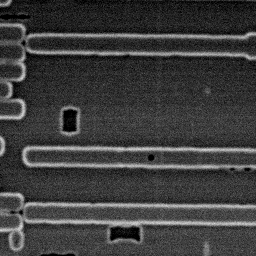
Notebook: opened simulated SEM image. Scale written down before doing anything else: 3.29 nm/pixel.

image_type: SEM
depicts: wiring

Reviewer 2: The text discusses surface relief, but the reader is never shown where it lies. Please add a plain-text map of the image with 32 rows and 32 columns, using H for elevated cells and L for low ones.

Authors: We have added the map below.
HLLLLLLLLLLLLLLLLLLLLLLLLLLLLLLL
LLLLLLLLLLLLLLLLLLLLLLLLLLLLLLLL
LLLLLLLLLLLLLLLLLLLLLLLLLLLLLLLL
HHHLLLLLLLLLLLLLLLLLLLLLLLLLLLLL
HHHLHHHHHHHHHHHHHHLLLLLLLLLLLLHH
HHHHHHHHHHHHHHHHHHHHHHHHHHHHHHHH
HHHLHHHHHHHHHHHHHHHHHHHHHHHHHHHH
HHHLLLLLLLLLLLLLLLLLLLLLLLLLLLLL
HHHLLLLLLLLLLLLLLLLLLLLLLLLLLLLL
HHHLLLLLLLLLLLLLLLLLLLLLLLLLLLLL
HLLLLLLLLLLLLLLLLLLLLLLLLLLLLLLL
HLLLLLLLLLLLLLLLLLLLLLLLLLLLLLLL
HHLLLLLLLLLLLLLLLLLLLLLLLLLLLLLL
HHHLLLLLLLLLLLLLLLLLLLLLLLLLLLLL
HHHLLLLLLLLLLLLLLLLLLLLLLLLLLLLL
LLLLLLLLLLLLLLLLLLLLLLLLLLLLLLLL
LLLLLLLLLLLLLLLLLLLLLLLLLLLLLLLL
LLLLLLLLLLLLLLLLLLLLLLLLLLLLLLLL
LLLHHHHHHHLHHLLLLLLLLLLLLLLLLLLL
LLLHHHHHHHHHHHHHHHHHHHHHHHHHHHHH
LLLHHHHHHHHHHHHHHHHHHHHHHHHHHHHH
LLLLLLLLLLLLLLLLLLLLLLLLLLLLLLLL
LLLLLLLLLLLLLLLLLLLLLLLLLLLLLLLL
LLLLLLLLLLLLLLLLLLLLLLLLLLLLLLLL
HHLLLLLLLLLLLLLLLLLLLLLLLLLLLLLL
HHHLLLLLLLLLLLLLLLLLLLLLLLLLLLLL
HHHHHHHHHHHHHHHHHHHHHHHHHHHHHHHH
HHHHHHHHHHHHHHHHHHHHHHHHHHHHHHHH
HHHLLLLLLLLLLLLLLLLLLLLLLLLLLLLL
LHHLLLLLLLLLLLLLLLLLLLLLLLLLLLLL
LLLLLLLLLLLLLLLLLLLLLLLLLLLLLLLL
LLLLLLLLLLLLLLLLLLLLLLLLLLLLLLLL